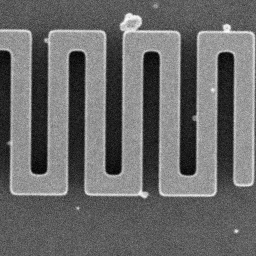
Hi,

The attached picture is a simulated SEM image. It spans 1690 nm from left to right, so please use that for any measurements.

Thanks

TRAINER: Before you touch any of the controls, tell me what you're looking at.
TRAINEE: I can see groups of lines, slits or small figures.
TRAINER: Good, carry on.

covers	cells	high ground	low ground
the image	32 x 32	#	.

................................
................................
................................
................................
####..#######..#######...#######
####..#######..########..#######
.###..###.###..###..###..###.###
.###..##...##..###..##...##..###
.###..##...##..###..##...##..###
.###..##...##..###..##...##..###
.###..##...##..###..##...##..###
.###..##...##..###..##...##..###
.###..##...##..###..##...##..###
.###..##...##..###..##...##..###
.###..##...##..###..##...##..###
.###..##...##..###..##...##..###
.###..##...##..###..##...##..###
.###..##...##..###..##...##..###
.###..##...##..###..##...##..###
.###..##...##..###..##...##..###
.###..##...##..###..##...##..###
.###..##...##..###..###.###..###
.#######...#######..#######..###
.#######...#######..#######.....
................................
................................
................................
................................
................................
................................
................................
................................